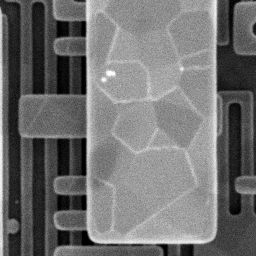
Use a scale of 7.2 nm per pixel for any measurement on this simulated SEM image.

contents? wiring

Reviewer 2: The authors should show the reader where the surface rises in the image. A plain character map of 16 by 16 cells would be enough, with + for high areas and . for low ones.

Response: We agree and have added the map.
.....++++++++...
.....++++++++...
.....++++++++...
.....++++++++...
.....++++++++...
.....++++++++...
.....+++++++++..
.....+++++++++..
.....+++++++++..
.....++++++++...
.....+++++++++..
.....+++++++++..
.....+++++++++..
.....+++++++++..
......+++++++...
................